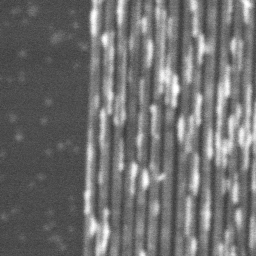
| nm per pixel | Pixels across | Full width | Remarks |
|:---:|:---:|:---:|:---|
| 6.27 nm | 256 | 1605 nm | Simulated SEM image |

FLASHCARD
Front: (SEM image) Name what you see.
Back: parallel lines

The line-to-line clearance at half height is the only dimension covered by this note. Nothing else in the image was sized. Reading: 29 nm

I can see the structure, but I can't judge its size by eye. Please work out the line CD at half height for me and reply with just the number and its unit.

51.7 nanometres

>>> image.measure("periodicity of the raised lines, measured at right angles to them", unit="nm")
79.3